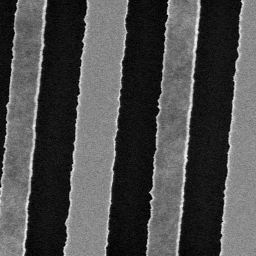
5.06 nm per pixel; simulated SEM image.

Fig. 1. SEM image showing lines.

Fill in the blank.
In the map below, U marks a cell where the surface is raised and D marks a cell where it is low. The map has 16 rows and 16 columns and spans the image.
DUUDDUUUDDUUDDDU
DUUDDUUUDDUUDDDU
DUUDDUUUDDUUDDDU
DUUDDUUUDDUUDDDU
DUUDDUUUDDUUDDDU
DUDDDUUUDDUUDDDU
UUDDDUUDDDUUDDDU
UUDDDUUDDDUUDDUU
UUDDDUUDDDUUDDUU
UUDDDUUDDDUUDDUU
UUDDDUUDDDUUDDUU
UUDDUUUDDDUUDDUU
UUDDUUUDDUUDDDUU
UUDDUUUDDUUDDDUU
UUDDUUUDDUUDDDUU
UUDDUUUDDUUDDDUU